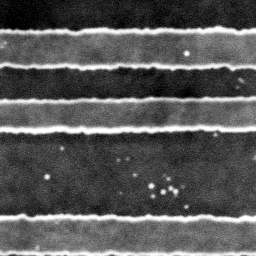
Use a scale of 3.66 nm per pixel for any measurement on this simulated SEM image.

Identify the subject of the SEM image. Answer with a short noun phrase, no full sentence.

lines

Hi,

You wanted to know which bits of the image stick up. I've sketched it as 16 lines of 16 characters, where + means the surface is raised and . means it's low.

................
................
++++++++++++++++
++++++++++++++++
++++++++++++++++
++++++++++++++++
++++++++++++++++
++++++++++++++++
................
................
................
................
................
................
++++++++++++++++
++++++++++++++++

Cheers